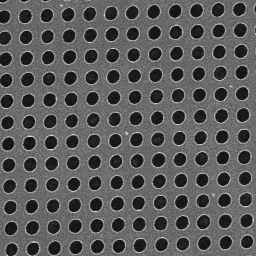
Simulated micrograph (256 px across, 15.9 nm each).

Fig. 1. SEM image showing a regular array of holes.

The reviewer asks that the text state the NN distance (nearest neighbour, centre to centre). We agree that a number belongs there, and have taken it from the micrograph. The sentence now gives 334 nm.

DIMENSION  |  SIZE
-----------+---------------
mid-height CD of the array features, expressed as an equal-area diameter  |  210 nm